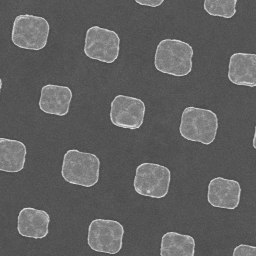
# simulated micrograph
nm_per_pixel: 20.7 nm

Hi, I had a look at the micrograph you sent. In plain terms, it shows a regular array of raised bodies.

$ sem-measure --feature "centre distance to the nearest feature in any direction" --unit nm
1490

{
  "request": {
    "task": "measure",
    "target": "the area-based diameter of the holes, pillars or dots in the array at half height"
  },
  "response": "735 nanometres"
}